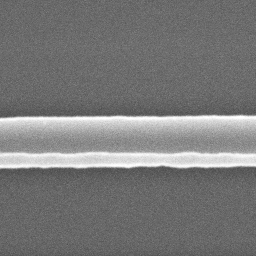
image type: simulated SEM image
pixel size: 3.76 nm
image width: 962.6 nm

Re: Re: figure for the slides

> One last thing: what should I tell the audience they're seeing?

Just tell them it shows lines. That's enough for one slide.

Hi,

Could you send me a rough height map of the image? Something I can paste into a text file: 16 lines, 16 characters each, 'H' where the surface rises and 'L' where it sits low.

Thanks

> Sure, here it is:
LLLLLLLLLLLLLLLL
LLLLLLLLLLLLLLLL
LLLLLLLLLLLLLLLL
LLLLLLLLLLLLLLLL
LLLLLLLLLLLLLLLL
LLLLLLLLLLLLLLLL
LLLLLLLLLLLLLLLL
HHHHHHHHHHHHHHHH
HHHHHHHHHHHHHHHH
HHHHHHHHHHHHHHHH
LLLLLLLLLLLLLLLL
LLLLLLLLLLLLLLLL
LLLLLLLLLLLLLLLL
LLLLLLLLLLLLLLLL
LLLLLLLLLLLLLLLL
LLLLLLLLLLLLLLLL